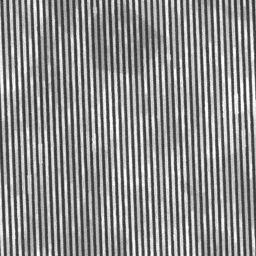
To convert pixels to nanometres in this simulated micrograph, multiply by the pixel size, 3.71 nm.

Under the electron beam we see parallel lines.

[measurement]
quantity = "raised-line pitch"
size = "22.2 nm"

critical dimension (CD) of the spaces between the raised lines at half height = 12.5 nm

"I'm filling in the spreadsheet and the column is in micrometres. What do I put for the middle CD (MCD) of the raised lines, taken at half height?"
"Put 0.0097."